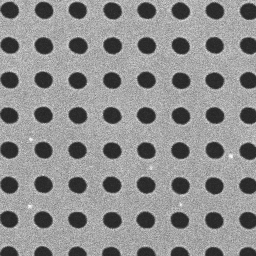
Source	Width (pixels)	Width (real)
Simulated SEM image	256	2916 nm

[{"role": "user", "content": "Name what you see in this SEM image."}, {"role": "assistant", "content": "a regular array of holes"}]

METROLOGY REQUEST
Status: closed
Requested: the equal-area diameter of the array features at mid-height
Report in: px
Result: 18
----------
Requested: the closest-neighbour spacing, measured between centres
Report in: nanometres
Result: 388